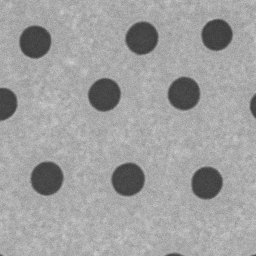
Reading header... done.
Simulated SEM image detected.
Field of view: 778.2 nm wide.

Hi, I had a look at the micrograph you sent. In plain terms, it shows a regular array of holes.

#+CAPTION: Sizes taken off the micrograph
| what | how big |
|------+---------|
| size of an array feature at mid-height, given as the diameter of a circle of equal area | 102 nm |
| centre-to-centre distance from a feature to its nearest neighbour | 222 nm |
